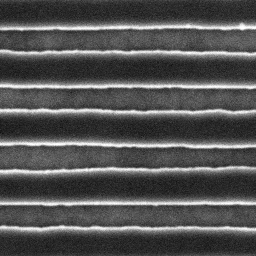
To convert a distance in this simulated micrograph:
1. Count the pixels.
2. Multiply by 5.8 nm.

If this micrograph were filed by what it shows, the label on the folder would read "lines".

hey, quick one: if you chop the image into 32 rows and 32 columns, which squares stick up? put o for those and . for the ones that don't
oooooooooooooooooooooooooooooooo
oooooooooooooooooooooooooooooooo
oooooooooooooooooooooooooooooooo
ooooooooooooooo..oo......oooooo.
................................
................................
oo....ooooooooooooooooo.........
oooooooooooooooooooooooooooooooo
oooooooooooooooooooooooooooooooo
oooooooooooooooooooooooooooooooo
oooooooooooooooooooooooooooooooo
................................
................................
................................
oooooooooooooooooooooooooooooooo
oooooooooooooooooooooooooooooooo
oooooooooooooooooooooooooooooooo
oooooooooooooooooooooooooooooooo
................................
................................
................................
oooooooooooooooooooooooooooooooo
oooooooooooooooooooooooooooooooo
oooooooooooooooooooooooooooooooo
oooooooooooooooooooooooooooooooo
ooooooooooooooooooooooooo.ooo.oo
................................
................................
ooooooooooooooooooooooooooooooo.
oooooooooooooooooooooooooooooooo
oooooooooooooooooooooooooooooooo
oooooooooooooooooooooooooooooooo